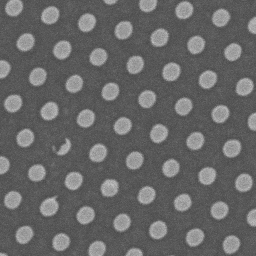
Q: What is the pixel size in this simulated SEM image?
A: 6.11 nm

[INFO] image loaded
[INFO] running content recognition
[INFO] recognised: a regular array of raised bodies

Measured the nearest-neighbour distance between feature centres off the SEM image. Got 222 nm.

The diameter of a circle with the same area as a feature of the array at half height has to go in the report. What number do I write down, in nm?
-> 99.7